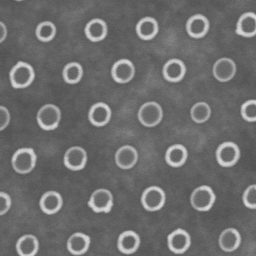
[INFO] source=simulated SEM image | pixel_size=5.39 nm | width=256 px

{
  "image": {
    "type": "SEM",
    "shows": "a regular array of raised bodies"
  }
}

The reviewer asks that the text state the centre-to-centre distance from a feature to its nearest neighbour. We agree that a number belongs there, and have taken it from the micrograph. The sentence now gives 264 nanometres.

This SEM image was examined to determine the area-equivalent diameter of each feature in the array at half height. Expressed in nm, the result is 118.